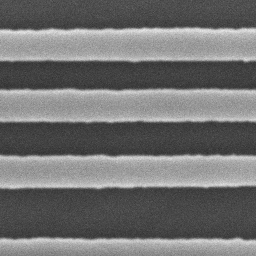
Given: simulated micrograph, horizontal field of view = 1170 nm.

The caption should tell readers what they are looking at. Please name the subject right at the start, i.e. lines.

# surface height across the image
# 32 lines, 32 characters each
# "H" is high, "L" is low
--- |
LLLLLLLLLLLLLLLLLLLLLLLLLLLLLLLL
LLLLLLLLLLLLLLLLLLLLLLLLLLLLLLLL
LLLLLLLLLLLLLLLLLLLLLLLLLLLLLLLL
LLLLLLLLLLLLLLLLLLLLLLLLLLLLLLLL
HHHHHHHHHHHHHHHHHHHHHHHHHHHHHHHH
HHHHHHHHHHHHHHHHHHHHHHHHHHHHHHHH
HHHHHHHHHHHHHHHHHHHHHHHHHHHHHHHH
HHHHHHHHHHHHHHHHHHHHHHHHHHHHHHHH
LLLLLLLLLLLLLLLLLLLLLLLLLLLLLLLL
LLLLLLLLLLLLLLLLLLLLLLLLLLLLLLLL
LLLLLLLLLLLLLLLLLLLLLLLLLLLLLLLL
HHHHHHHHHHHHHHHHHHHHHHHHHHHHHHHH
HHHHHHHHHHHHHHHHHHHHHHHHHHHHHHHH
HHHHHHHHHHHHHHHHHHHHHHHHHHHHHHHH
HHHHHHHHHHHHHHHHHHHHHHHHHHHHHHHH
LLLLLLLLLLLLLLLLLLLLLLLLLLLLLLLL
LLLLLLLLLLLLLLLLLLLLLLLLLLLLLLLL
LLLLLLLLLLLLLLLLLLLLLLLLLLLLLLLL
LLLLLLLLLLLLLLLLLLLLLLLLLLLLLLLL
LLLLLLLLLLLHHLLLLLLLLLLHHLLHLHLL
HHHHHHHHHHHHHHHHHHHHHHHHHHHHHHHH
HHHHHHHHHHHHHHHHHHHHHHHHHHHHHHHH
HHHHHHHHHHHHHHHHHHHHHHHHHHHHHHHH
HHHLLLLLLLLLHLLLLLLLLLLLLLLLLLLL
LLLLLLLLLLLLLLLLLLLLLLLLLLLLLLLL
LLLLLLLLLLLLLLLLLLLLLLLLLLLLLLLL
LLLLLLLLLLLLLLLLLLLLLLLLLLLLLLLL
LLLLLLLLLLLLLLLLLLLLLLLLLLLLLLLL
LLLLLLLLLLLLLLLLLLLLLLLLLLLLLLLL
LLLLLLLLLLLLLLLLLLLLLLLLLLLLLLLL
HHHHHHHHHHHHHHHHHHHHHHHHHHHHHHHH
HHHHHHHHHHHHHHHHHHHHHHHHHHHHHHHH